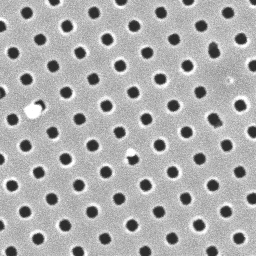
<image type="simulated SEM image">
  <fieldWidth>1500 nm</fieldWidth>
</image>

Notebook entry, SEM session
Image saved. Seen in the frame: a regular array of holes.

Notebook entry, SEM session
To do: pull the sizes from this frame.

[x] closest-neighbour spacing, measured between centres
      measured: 172 nm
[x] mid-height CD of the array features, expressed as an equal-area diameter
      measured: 74.5 nanometers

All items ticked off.